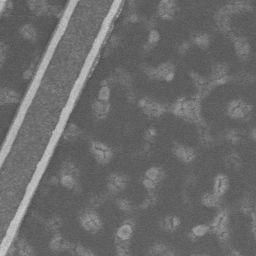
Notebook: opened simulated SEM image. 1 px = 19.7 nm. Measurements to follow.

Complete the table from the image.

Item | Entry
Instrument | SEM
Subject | one or a few lines or trenches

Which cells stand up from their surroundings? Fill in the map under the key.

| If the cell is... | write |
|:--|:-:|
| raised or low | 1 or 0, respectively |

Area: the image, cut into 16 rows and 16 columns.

0000111000000000
0000111000000000
0001110000000000
0001110000000000
0001100000000000
0011100000000000
0011000000000000
0111000000000000
0110000000000000
1110000000000000
1110000000000000
1100000000000000
1100000000000000
1000000000000000
1000000000000000
0000000000000000